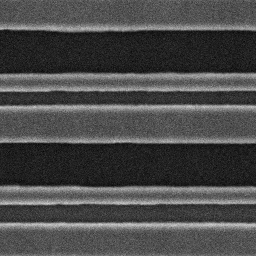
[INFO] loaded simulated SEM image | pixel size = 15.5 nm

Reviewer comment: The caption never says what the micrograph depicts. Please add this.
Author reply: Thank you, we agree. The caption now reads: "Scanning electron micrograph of lines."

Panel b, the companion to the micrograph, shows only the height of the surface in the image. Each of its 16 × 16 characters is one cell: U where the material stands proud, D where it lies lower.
UUUUUUUUUUUUUUUU
UUUUUUUUUUUUUUUU
DDDDDDDDDDDDDDDD
DDDDDDDDDDDDDDDD
DDDDDDDDDDDDDDDD
UUUUUUUUUUUUUUUU
UUUUUUUUUUUUUUUU
UUUUUUUUUUUUUUUU
UUUUUUUUUUUUUUUU
DDDDDDDDDDDDDDDD
DDDDDDDDDDDDDDDD
DDDDDDDDDDDDDDDD
UUUUUUUUUUUUUUUU
UUUUUUUUUUUUUUUU
UUUUUUUUUUUUUUUU
UUUUUUUUUUUUUUUU